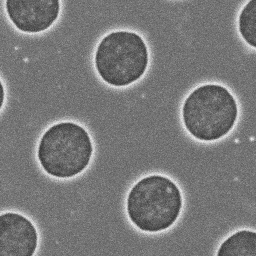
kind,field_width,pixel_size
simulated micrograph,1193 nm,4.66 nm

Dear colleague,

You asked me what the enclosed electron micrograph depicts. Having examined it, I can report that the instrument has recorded holes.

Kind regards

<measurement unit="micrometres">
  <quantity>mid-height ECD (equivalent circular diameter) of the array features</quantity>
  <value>0.254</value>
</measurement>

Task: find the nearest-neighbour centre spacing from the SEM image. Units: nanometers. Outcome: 483